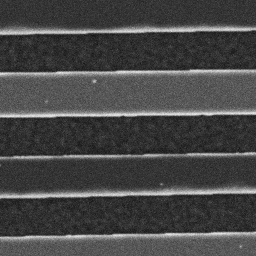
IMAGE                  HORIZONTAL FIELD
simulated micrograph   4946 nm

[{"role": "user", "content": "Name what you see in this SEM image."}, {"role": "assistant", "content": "lines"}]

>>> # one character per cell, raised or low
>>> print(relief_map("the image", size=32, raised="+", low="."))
++++++++++++++++++++++++++++++++
++++++++++++++++++++++++++++++++
++++++++++++++++++++++++++++++++
++++++++++++++++++++++++++++++++
................................
................................
................................
................................
................................
++++++++++++++++++++++++++++++++
++++++++++++++++++++++++++++++++
++++++++++++++++++++++++++++++++
++++++++++++++++++++++++++++++++
++++++++++++++++++++++++++++++++
++++............................
................................
................................
................................
................................
........++++++++++++++++++++++++
++++++++++++++++++++++++++++++++
++++++++++++++++++++++++++++++++
++++++++++++++++++++++++++++++++
++++++++++++++++++++++++++++++++
++++++++........................
................................
................................
................................
................................
........++++++++++++++++++++++++
++++++++++++++++++++++++++++++++
++++++++++++++++++++++++++++++++